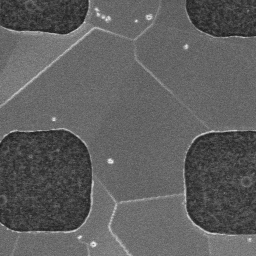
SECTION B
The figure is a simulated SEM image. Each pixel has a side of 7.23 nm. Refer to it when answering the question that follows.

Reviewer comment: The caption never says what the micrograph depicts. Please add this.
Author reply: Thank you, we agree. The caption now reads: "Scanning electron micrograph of holes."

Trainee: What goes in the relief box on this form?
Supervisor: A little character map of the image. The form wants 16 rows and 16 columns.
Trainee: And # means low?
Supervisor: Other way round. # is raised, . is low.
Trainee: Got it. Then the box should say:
......######....
.....#######....
################
################
################
################
################
################
.....########...
......######....
......######....
......######....
......######....
......######....
#.#.#########...
################